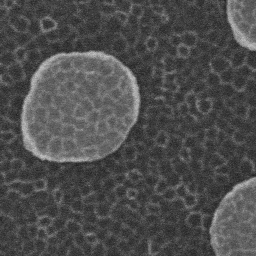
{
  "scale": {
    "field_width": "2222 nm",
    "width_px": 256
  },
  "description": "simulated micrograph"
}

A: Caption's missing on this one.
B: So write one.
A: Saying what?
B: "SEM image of raised bodies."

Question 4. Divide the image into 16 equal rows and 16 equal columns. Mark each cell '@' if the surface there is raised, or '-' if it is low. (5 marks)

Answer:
--------------@@
---------------@
---------------@
----@@@---------
--@@@@@@--------
--@@@@@@--------
--@@@@@@@-------
-@@@@@@@--------
--@@@@@@--------
--@@@@@---------
----------------
---------------@
--------------@@
-------------@@@
-------------@@@
-------------@@@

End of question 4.